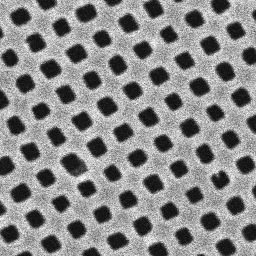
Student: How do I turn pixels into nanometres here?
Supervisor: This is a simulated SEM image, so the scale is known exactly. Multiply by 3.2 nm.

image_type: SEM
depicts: a regular array of holes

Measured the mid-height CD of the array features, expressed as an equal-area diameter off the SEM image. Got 57.6 nm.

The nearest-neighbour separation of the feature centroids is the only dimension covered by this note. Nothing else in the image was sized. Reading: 94.4 nm